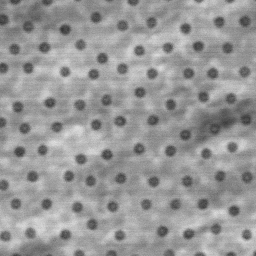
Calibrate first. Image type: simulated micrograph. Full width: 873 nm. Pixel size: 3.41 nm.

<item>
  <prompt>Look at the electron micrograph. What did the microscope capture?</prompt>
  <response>a regular array of holes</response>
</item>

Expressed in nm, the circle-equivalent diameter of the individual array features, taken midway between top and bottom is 39.1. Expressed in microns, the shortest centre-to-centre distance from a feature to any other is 0.0866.